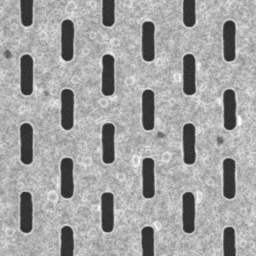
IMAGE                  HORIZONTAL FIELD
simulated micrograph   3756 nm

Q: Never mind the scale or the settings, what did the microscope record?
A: a regular array of holes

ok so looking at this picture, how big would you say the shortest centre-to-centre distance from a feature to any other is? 772 nm